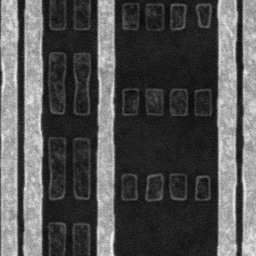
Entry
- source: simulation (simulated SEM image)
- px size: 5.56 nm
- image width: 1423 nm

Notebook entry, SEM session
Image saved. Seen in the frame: wiring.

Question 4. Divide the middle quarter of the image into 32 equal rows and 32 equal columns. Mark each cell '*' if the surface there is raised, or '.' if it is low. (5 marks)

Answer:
...****..***....................
...****..***....................
...***...***....................
...***...***....................
...***...***....................
...***...***....................
...***...***...***...***...***..
...***...***...****..****..****.
...***...***...****..*.**..****.
...***...***...***...*.**..****.
...***...***...***...****..****.
...***...***...***...****..****.
...***...***...***...***...****.
.........***....................
.........***....................
.........***....................
.........***....................
.........***....................
.........***....................
...***...***....................
...***...***....................
...***...***....................
...***...***....................
...***...***....................
...***...***....................
...***...***....................
...***...***....................
...***...***....................
...***...***...***...****..****.
...***...***...***...****..****.
...***...***...***...****..****.
...***...***...***...***...****.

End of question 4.